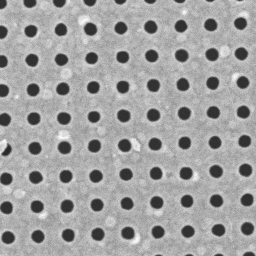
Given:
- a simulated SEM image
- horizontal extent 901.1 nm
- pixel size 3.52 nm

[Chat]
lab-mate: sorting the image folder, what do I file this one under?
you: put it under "a regular array of holes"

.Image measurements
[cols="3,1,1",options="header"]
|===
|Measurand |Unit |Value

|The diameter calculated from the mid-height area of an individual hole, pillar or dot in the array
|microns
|0.046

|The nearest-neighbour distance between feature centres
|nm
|102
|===